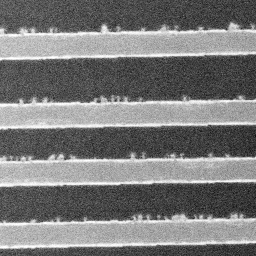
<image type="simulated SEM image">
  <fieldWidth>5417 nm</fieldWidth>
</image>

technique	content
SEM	lines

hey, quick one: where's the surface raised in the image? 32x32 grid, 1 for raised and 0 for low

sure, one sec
00000000000000000000000000000000
00000000000000000000000000000000
00000000000000000000000000000000
00000000000000000000000000000100
11111111111111111111111111111111
11111111111111111111111111111111
11111111111111111111111111111111
00000000000000000000000000000000
00000000000000000000000000000000
00000000000000000000000000000000
00000000000000000000000000000000
00000000000000000000000000000000
00000000000000000000000000000000
11111111111111111111111111111111
11111111111111111111111111111111
11111111111111111111111110000000
00000000000000000000000000000000
00000000000000000000000000000000
00000000000000000000000000000000
00000000000000000000000000000000
11111111111111111111111111111111
11111111111111111111111111111111
11111111111111111111111111111111
00000000000000000000000000000000
00000000000000000000000000000000
00000000000000000000000000000000
00000000000000000000000000000000
00000000000000000100001000000111
11111111111111111111111111111111
11111111111111111111111111111111
11111111111111111010000000000000
00000000000000000000000000000000